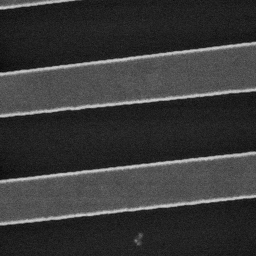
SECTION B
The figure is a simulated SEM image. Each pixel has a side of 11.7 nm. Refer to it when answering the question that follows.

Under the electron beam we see lines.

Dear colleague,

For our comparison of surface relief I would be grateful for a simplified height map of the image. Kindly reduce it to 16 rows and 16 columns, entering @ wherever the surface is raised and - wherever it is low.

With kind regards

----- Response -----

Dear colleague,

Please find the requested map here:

@---------------
----------------
----------------
---------@@@@@@@
-@@@@@@@@@@@@@@@
@@@@@@@@@@@@@@@@
@@@@@@@@--------
----------------
----------------
----------------
-------@@@@@@@@@
@@@@@@@@@@@@@@@@
@@@@@@@@@@@@@@--
@@@@@-----------
----------------
----------------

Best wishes